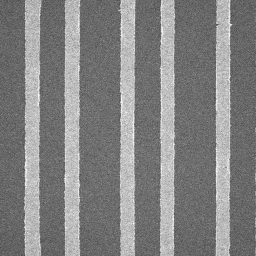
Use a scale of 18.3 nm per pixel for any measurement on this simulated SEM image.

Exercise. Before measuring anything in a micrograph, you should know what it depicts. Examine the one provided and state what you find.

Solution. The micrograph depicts parallel lines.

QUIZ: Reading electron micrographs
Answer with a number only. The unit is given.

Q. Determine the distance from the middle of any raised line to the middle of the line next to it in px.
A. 47.7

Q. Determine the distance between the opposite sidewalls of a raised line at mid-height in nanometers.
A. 240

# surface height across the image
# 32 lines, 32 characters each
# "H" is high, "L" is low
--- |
LLLHHLLLHHLLLLLHHLLLHHLLLLLHHLLL
LLLHHLLLHHLLLLLHHLLLHHLLLLLHHLLL
LLLHHLLLHHLLLLLHHLLLHHLLLLLHHLLL
LLLHHLLLHHLLLLLHHLLLHHLLLLLHHLLL
LLLHHLLLHHLLLLLHHLLLHHLLLLLHHLLL
LLLHHLLLHHLLLLLHHLLLHHLLLLLHHLLL
LLLHHLLLHHLLLLLHHLLLHHLLLLLHHLLL
LLLHHLLLHHLLLLLHHLLLHHLLLLLHHLLL
LLLHHLLLHHLLLLLHHLLLHHLLLLLHHLLL
LLLHHLLLHHLLLLLHHLLLHHLLLLLHHLLL
LLLHHLLLHHLLLLLHHLLLHHLLLLLHHLLL
LLLHHLLLHHLLLLLHHLLLHHLLLLLHHLLL
LLLHHLLLHHLLLLLHHLLLHHLLLLLHHLLL
LLLHHLLLHHLLLLLHHLLLHHLLLLLHHLLL
LLLHHLLLHHLLLLLHHLLLHHLLLLLHHLLL
LLLHHLLLHHLLLLLHHLLLHHLLLLLHHLLL
LLLHHLLLHHLLLLLHHLLLHHLLLLLHHLLL
LLLHHLLLHHLLLLLHHLLLHHLLLLLHHLLL
LLLHHLLLHHLLLLLHHLLLHHLLLLLHHLLL
LLLHHLLLHHLLLLLHHLLLHHLLLLLHHLLL
LLLHHLLLHHLLLLLHHLLLHHLLLLLHLLLL
LLLHHLLLHHLLLLLHHLLLHHLLLLLHLLLL
LLLHHLLLHHLLLLLHHLLLHHLLLLLHHLLL
LLLHHLLLHHLLLLLHHLLLHHLLLLLHHLLL
LLLHHLLLHHLLLLLHHLLLHHLLLLLHHLLL
LLLHHLLLHHLLLLLHHLLLHHLLLLLHHLLL
LLLHHLLLHHLLLLLHHLLLHHLLLLLHHLLL
LLLHHLLLHHLLLLLHHLLLHHLLLLLHHLLL
LLLHHLLLHHLLLLLHHLLLHHLLLLLHHLLL
LLLHHLLLHHLLLLLHHLLLHHLLLLLHHLLL
LLLHHLLLHHLLLLLHLLLLHHLLLLLHHLLL
LLLHHLLLHHLLLLLHHLLLHHLLLLLHHLLL